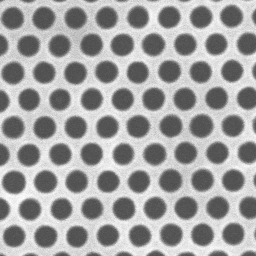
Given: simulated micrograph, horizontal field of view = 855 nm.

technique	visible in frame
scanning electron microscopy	a regular array of holes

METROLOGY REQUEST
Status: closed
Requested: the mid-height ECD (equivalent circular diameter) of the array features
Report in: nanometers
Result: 76.4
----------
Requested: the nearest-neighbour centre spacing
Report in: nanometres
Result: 103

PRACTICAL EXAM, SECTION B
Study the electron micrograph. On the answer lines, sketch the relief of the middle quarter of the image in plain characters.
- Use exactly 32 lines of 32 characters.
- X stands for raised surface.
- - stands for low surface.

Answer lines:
X----XXX-----XXX-----XXX-----XXX
------XX------XX-----XX------XX-
------XX------X------XX------XX-
-----XXX-----XXX-----XXX-----XXX
X----XXXX---XXXXX---XXXXX---XXXX
XXXXXXXXXXXXXXXXXXXXXXXXXXXXXXXX
-XXXX----XXXX---XXXXX---XXXX----
--XX-----XXX-----XXX-----XXX----
--XX------XX-----XX------XX-----
--XX------XX-----XXX-----XX-----
-XXX-----XXX-----XXX-----XXX----
XXXXX---XXXXXX--XXXXX---XXXXX--X
XXXXXXXXXXXXXXXXXXXXXXXXXXXXXXXX
X----XXXX----XXXX---XXXXX----XXX
-----XXX-----XXX-----XXX-----XXX
------XX------XX------XX------X-
------XX------XX-----XXX-----XXX
X----XXX-----XXX-----XXXX----XXX
XX--XXXXXX-XXXXXXX-XXXXXXX-XXXXX
XXXXXXXXXXXXXXXXXXXXXXXXXXXXXX-X
-XXXX----XXXX----XXXX----XXX----
--XX------XX-----XXX-----XXX----
--XX------XX------XX------X-----
--XX------XX-----XXX-----XXX----
-XXXX----XXXX----XXXX----XXXX---
XXXXXX-XXXXXXXXXXXXXXX-XXXXXXXXX
XXXXXXXXXXX-XXXXXXXXXXXXXX--XXXX
X----XXXX----XXXX----XXX-----XXX
------XX------XX------XX-----XXX
------XX------XX------X------XXX
X-----XX------XX-----XXX-----XXX
X----XXXX----XXXX----XXXX----XXX